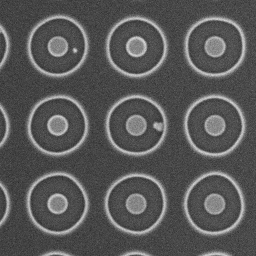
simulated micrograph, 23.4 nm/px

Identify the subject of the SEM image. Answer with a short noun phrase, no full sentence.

an array of small figures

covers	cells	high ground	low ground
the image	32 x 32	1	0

11111111111111111111111111111111
11111111111111111111111111111111
11111100011111110011111111001111
11111000001111000000111100000011
01110000000111000000111100000011
01110011000111001100011000110011
01110011000111001100011000110011
11110000001111000000111100000011
11111000011111100001111110000111
11111111111111111111111111111111
11111111111111111111111111111111
11111111111111111111111111111111
11111100011111110011111110001111
11111000001111000000111100000011
01110000000111000000111100000011
01110011000111001100111000110011
01110001000111001100111100110011
11110000001111000000111100000011
11111000011111100001111110000111
11111111111111111111111111111111
11111111111111111111111111111111
11111111111111111111111111111111
11111000011111100001111110000111
11110000001111000000111100000011
01110001000111001100111000100011
01110011000110001100111000110011
01110001000111001100111000110011
11110000001111000000111100000011
11111000011111100001111110000111
11111111111111111111111111111111
11111111111111111111111111111111
11111111111111111111111111111111